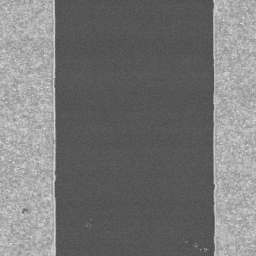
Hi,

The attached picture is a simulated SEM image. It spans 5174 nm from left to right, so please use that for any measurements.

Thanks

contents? one or a few lines or trenches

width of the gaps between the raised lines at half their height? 3240 nm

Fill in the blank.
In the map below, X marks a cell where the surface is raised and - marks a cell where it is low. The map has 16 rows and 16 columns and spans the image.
XXX----------XXX
XXX----------XXX
XXX----------XXX
XXX----------XXX
XXX----------XXX
XXX----------XXX
XXX----------XXX
XXX----------XXX
XXX----------XXX
XXX----------XXX
XXX----------XXX
XXX-----------XX
XXX----------XXX
X------------XXX
XXX----------XXX
XXX----------XXX